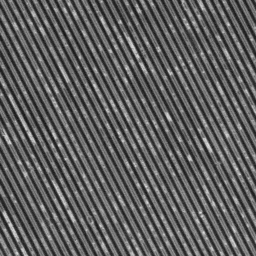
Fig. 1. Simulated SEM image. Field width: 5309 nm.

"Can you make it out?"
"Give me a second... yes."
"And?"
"parallel lines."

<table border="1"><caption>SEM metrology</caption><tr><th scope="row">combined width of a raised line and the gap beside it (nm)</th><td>152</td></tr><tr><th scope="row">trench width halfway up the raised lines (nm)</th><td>81.9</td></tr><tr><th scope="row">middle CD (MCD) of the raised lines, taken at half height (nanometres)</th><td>60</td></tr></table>